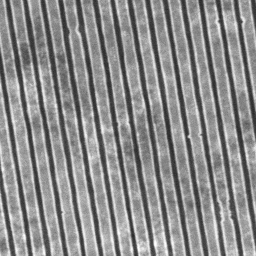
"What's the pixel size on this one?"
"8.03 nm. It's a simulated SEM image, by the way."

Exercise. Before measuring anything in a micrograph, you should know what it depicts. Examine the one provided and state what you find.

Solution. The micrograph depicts parallel lines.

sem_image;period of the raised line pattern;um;0.139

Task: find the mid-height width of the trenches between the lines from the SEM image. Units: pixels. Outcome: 5.55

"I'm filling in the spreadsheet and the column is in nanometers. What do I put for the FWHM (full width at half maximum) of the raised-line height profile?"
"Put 95.1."